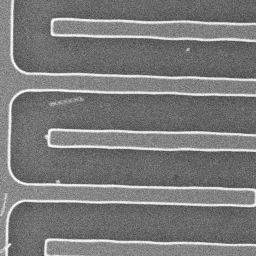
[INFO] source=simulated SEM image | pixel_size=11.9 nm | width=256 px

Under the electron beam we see groups of lines, slits or small figures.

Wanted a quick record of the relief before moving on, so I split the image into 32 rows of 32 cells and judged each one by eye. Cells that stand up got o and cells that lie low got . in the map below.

oo..............................
oo..............................
oo.....oooo.....................
oo....oooooooooooooooooooooooooo
oo........oooooooooooooooooooooo
o...............................
o...............................
oo..............................
oo..............................
oooooooooooooooo................
oooooooooooooooooooooooooooooooo
ooo..........ooooooooooooooooooo
oo..............................
o...............................
o...............................
o...............................
o.....ooooooooooo...............
o.....oooooooooooooooooooooooooo
o................ooooooooooooooo
o...............................
o...............................
o...............................
oo..............................
ooooooooooooooooooooo...........
oooooooooooooooooooooooooooooooo
oo....................oooooooooo
o...............................
o...............................
o...............................
o...............................
o.....oooooooooooooooooooo......
o.....oooooooooooooooooooooooooo